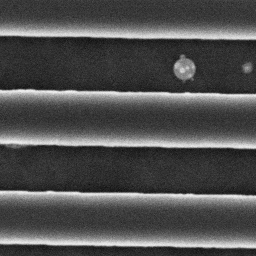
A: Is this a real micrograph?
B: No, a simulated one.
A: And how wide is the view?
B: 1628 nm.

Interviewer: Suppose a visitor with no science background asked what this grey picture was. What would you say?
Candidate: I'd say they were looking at lines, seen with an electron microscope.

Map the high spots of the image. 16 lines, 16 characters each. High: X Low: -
XXXXXXXXXXXXXXXX
XXXXXXXXXXXXXXXX
----------------
----------------
----------------
----------------
XXXXXXXXXXXXXXXX
XXXXXXXXXXXXXXXX
XXXXXXXXXXXXXXXX
----------------
----------------
----------------
XXXXXXXXXXXXXXXX
XXXXXXXXXXXXXXXX
XXXXXXXXXXXXXXXX
----------------